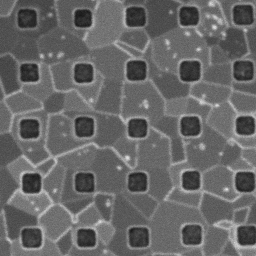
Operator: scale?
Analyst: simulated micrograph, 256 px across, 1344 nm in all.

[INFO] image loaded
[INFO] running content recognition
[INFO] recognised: a regular array of holes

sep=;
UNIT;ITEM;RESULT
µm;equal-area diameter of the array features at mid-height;0.119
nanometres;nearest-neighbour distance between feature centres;279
